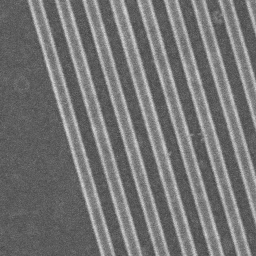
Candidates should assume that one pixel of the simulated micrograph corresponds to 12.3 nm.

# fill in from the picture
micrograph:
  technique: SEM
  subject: parallel lines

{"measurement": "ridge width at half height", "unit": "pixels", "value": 12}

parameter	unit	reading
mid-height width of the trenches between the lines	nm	181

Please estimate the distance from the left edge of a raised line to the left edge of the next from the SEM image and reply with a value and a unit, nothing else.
0.323 um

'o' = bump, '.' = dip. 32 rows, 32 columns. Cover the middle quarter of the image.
...ooo...oooo...ooo....ooo....oo
...ooo....ooo....ooo...oooo...oo
...ooo....ooo....ooo....ooo...oo
....ooo...ooo....ooo....ooo....o
....ooo....ooo....oo....ooo....o
....ooo....ooo....ooo....ooo...o
o...ooo....ooo....ooo....ooo....
o....ooo....ooo...ooo....ooo....
o....ooo....ooo....ooo...oooo...
oo...ooo....ooo....ooo....ooo...
oo....ooo...ooo....ooo....ooo...
oo....ooo....ooo....oo....ooo...
oo....ooo....ooo....ooo....ooo..
ooo....ooo...ooo....ooo....ooo..
ooo....ooo....ooo...ooo....ooo..
ooo....ooo....ooo....ooo...oooo.
oooo...ooo....ooo....ooo....ooo.
.ooo....ooo...ooo....ooo....ooo.
.ooo....ooo....ooo....oo....ooo.
.ooo....ooo....ooo....ooo....ooo
..ooo....oo....ooo....ooo....ooo
..ooo....ooo....ooo...ooo....ooo
..ooo....ooo....ooo....ooo...ooo
...ooo...ooo....ooo....ooo....oo
...ooo....ooo...ooo....ooo....oo
...ooo....ooo....ooo....ooo...oo
...ooo....ooo....ooo....ooo....o
....ooo....oo....ooo....ooo....o
....ooo....ooo....ooo...ooo....o
....ooo....ooo....ooo....ooo...o
.....ooo...ooo....ooo....ooo....
.....ooo....ooo...oooo...ooo....